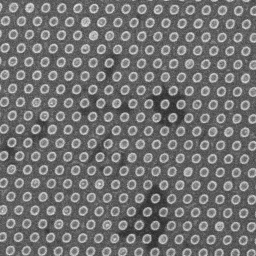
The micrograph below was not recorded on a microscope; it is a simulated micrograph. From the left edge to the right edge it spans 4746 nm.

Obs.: a regular array of raised bodies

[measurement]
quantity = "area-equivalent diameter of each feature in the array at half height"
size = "165 nanometers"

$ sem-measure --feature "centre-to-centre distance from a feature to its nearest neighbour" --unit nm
288